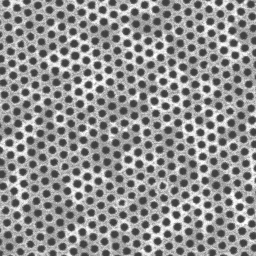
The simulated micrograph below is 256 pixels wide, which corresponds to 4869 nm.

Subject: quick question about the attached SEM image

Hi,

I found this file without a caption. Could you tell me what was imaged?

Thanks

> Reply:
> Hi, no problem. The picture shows a regular array of holes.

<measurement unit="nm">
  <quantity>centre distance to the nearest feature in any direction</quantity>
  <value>228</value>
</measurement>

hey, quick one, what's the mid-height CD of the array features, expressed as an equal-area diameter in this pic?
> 0.165 micrometres